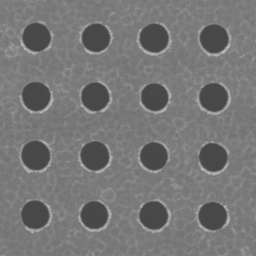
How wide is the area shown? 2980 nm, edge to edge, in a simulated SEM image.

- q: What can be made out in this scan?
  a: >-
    a regular array of holes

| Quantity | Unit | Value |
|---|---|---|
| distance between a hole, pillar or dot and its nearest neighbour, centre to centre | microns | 0.686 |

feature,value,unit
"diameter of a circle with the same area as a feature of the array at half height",28.6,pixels